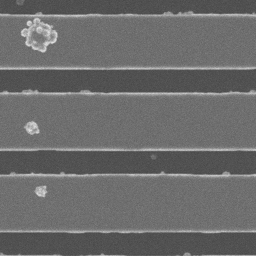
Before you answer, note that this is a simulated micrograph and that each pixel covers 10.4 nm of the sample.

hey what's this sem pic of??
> lines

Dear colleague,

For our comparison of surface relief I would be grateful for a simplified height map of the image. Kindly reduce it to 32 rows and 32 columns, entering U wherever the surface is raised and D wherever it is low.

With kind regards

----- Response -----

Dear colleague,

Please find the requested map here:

DDDDDDDDDDDDDDDDDDDDDDDDDDDDDDDD
DDDDDDDDDDDDDDDDDDDDDDDDDDDDDDDD
UUUUUUUUUUUUUUUUUUUUUUUUUUUUUUUU
UUUUUUUUUUUUUUUUUUUUUUUUUUUUUUUU
UUUUUUUUUUUUUUUUUUUUUUUUUUUUUUUU
UUUUUUUUUUUUUUUUUUUUUUUUUUUUUUUU
UUUUUUUUUUUUUUUUUUUUUUUUUUUUUUUU
UUUUUUUUUUUUUUUUUUUUUUUUUUUUUUUU
UUUUUUUUUUUUUUUUUUUUUUUUUUUUUUUU
DDDDDDDDDDDDDDDDDDDDDDDDDDDDDDDD
DDDDDDDDDDDDDDDDDDDDDDDDDDDDDDDD
DDDDDDDDDDDDDDDDDDDDDDDDDDDDDDDD
UUUUUUUUUUUUUUUUUUUUUUUUUUUUUUUU
UUUUUUUUUUUUUUUUUUUUUUUUUUUUUUUU
UUUUUUUUUUUUUUUUUUUUUUUUUUUUUUUU
UUUUUUUUUUUUUUUUUUUUUUUUUUUUUUUU
UUUUUUUUUUUUUUUUUUUUUUUUUUUUUUUU
UUUUUUUUUUUUUUUUUUUUUUUUUUUUUUUU
UUUUUUUUUUUUUUUUUUUUUUUUUUUUUUUU
DDDDDDDDDDDDDDDDDDDDDDDDDDDDDDDD
DDDDDDDDDDDDDDDDDDDDDDDDDDDDDDDD
DDDDDDDDDDDDDDDDDDDDDDDDDDDDDDDD
UUUUUUUUUUUUUUUUUUUUUUUUUUUUUUUU
UUUUUUUUUUUUUUUUUUUUUUUUUUUUUUUU
UUUUUUUUUUUUUUUUUUUUUUUUUUUUUUUU
UUUUUUUUUUUUUUUUUUUUUUUUUUUUUUUU
UUUUUUUUUUUUUUUUUUUUUUUUUUUUUUUU
UUUUUUUUUUUUUUUUUUUUUUUUUUUUUUUU
UUUUUUUUUUUUUUUUUUUUUUUUUUUUUUUU
DDDDDDDDDDDDDDDDDDDDDDDDDDDDDDDD
DDDDDDDDDDDDDDDDDDDDDDDDDDDDDDDD
DDDDDDDDDDDDDDDDDDDDDDDDDDDDDDDD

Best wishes